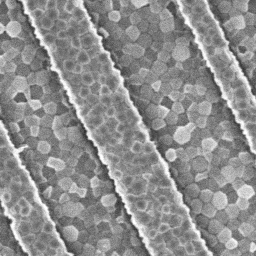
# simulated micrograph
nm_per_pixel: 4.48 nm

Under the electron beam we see one or a few lines or trenches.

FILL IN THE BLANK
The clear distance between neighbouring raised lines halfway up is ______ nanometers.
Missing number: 360